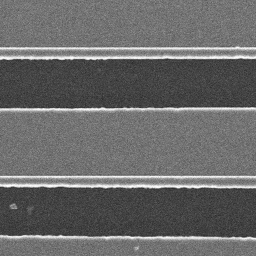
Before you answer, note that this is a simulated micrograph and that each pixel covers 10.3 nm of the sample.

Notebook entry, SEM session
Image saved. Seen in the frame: lines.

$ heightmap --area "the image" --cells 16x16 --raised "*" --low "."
****************
****************
****************
****************
................
................
................
****************
****************
****************
****************
****************
................
................
................
****************